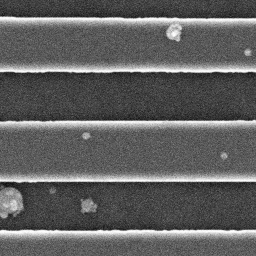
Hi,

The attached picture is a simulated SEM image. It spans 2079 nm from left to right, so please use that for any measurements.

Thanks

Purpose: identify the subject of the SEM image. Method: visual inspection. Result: lines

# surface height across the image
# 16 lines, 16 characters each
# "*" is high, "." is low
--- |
................
****************
****************
****************
................
................
................
................
****************
****************
****************
................
................
................
****************
****************